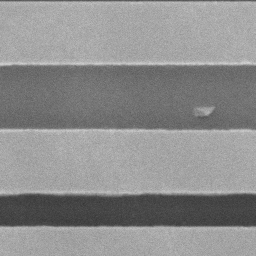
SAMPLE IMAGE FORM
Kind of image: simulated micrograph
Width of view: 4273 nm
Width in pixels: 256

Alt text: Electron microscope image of lines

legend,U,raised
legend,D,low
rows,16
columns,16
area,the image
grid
UUUUUUUUUUUUUUUU
UUUUUUUUUUUUUUUU
UUUUUUUUUUUUUUUU
UUUUUUUUUUUUUUUU
DDDDDDDDDDDDDDDD
DDDDDDDDDDDDDDDD
DDDDDDDDDDDDDDDD
DDDDDDDDDDDDDDDD
UUUUUUUUUUUUUUUU
UUUUUUUUUUUUUUUU
UUUUUUUUUUUUUUUU
UUUUUUUUUUUUUUUU
DDDDDDDDDDDDDDDD
DDDDDDDDDDDDDDDD
UUUUUUUUUUUUUUUU
UUUUUUUUUUUUUUUU